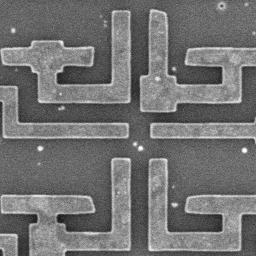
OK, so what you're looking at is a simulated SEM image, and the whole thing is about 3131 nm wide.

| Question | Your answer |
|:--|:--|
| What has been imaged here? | wiring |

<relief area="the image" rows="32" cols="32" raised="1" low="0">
00000000000000000000000000000000
00000000000000110001000000000000
00000000000000110001100000000000
00000000000000110001100000000000
00000000000000110001100000000000
00001111000000110001100000000000
11111111111100110001100111111111
11111111111100110001100111111111
00001111000000110001100000001100
00000110000000110011100000001100
00000110000000110011110000001100
11000111111111110011111111111100
11000111111111110011111111111100
11000000000000000011110000000000
11000000000000000000000000000000
11111111111111110001111111111111
11111111111111110001111111111111
00000000000000000000000000000000
00000000000000000000000000000000
00000000000000000000000000000000
00000000000000110001100000000000
00000000000000110001100000000000
00000000000000110001100000000000
00000000000000110001100000000000
00000000000000110001100000000000
11111111111100110001100111111111
11111111111000110001100011111111
00000110000000110001100000001100
00001111000000110001100000001100
11001111111111110001111111111100
11001111111111110001111111111100
11001111000000000000000000000000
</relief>